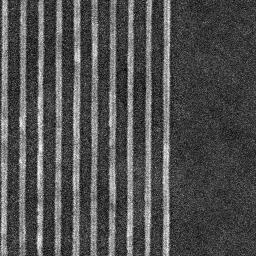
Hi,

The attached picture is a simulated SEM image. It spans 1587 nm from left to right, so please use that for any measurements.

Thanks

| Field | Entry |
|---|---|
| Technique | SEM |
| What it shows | parallel lines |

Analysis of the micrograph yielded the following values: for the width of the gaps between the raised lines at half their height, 85.3 nanometres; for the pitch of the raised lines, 0.112 micrometres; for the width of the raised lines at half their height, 28.7 nm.